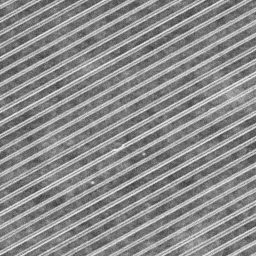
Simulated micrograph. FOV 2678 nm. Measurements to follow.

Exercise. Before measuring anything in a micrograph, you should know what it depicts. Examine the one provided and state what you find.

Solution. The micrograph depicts parallel lines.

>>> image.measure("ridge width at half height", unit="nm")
29.8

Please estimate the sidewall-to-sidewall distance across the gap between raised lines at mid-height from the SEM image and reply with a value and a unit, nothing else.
87.1 nanometers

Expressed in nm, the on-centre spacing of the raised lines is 118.